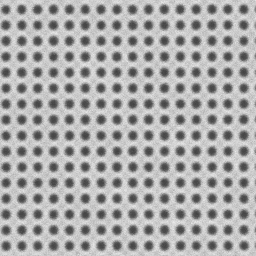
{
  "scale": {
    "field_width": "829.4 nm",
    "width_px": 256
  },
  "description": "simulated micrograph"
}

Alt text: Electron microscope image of a regular array of holes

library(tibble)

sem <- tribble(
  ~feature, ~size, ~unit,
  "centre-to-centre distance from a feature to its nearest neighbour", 0.0506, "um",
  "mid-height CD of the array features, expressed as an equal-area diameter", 0.0323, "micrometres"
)